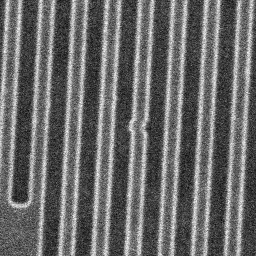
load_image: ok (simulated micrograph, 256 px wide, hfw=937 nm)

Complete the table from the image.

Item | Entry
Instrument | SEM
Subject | parallel lines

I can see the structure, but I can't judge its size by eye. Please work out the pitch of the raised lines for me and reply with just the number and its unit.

121 nanometers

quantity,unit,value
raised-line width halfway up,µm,0.0517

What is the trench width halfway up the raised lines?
71.8 nanometres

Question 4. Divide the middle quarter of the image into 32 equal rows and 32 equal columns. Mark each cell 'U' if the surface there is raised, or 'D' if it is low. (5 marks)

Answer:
DDUUUDDDDDUUUDDDDDUUUDDDDDUUUUDD
DDUUUDDDDDUUUDDDDDUUUDDDDDUUUDDD
DUUUUDDDDDUUUDDDDDUUUDDDDDUUUDDD
DUUUUDDDDDUUUDDDDDUUUDDDDDUUUDDD
DUUUUDDDDDUUUDDDDDUUUDDDDDUUUDDD
DUUUUDDDDDUUUDDDDDUUUDDDDDUUUDDD
DUUUDDDDDUUUUDDDDDUUUDDDDDUUUDDD
DUUUDDDDDUUUUDDDDDUUUDDDDDUUUDDD
DUUUDDDDDUUUUDDDDDUUUDDDDDUUUDDD
DUUUDDDDDUUUUDDDDDUUUDDDDDUUUDDD
DUUUDDDDDUUUUDDDDUUUUDDDDDUUUDDD
DUUUDDDDDUUUUDDDDUUUUDDDDDUUUDDD
DUUUDDDDDUUUDDDDDUUUUDDDDDUUUDDD
DUUUDDDDDUUUDDDDDUUUUDDDDDUUUDDD
DUUUDDDDDUUUDDDDDUUUDDDDDDUUUDDD
DUUUDDDDDUUUDDDDDUUUDDDDDUUUUDDD
DUUUDDDDDUUUDDDDUUUUDDDDDUUUUDDD
DUUUDDDDDUUUDDDDDUUUDDDDDUUUUDDD
DUUUDDDDDUUUDDDDDUUUDDDDDUUUUDDD
DUUUDDDDDUUUDDDDDUUUDDDDDUUUUDDD
DUUUDDDDDUUUDDDDDUUUDDDDDUUUDDDD
UUUUDDDDDUUUDDDDDUUUDDDDDUUUDDDD
UUUUDDDDDUUUDDDDDUUUDDDDDUUUDDDD
UUUUDDDDDUUUDDDDDUUUDDDDDUUUDDDD
UUUDDDDDDUUUDDDDDUUUDDDDDUUUDDDD
UUUDDDDDUUUUDDDDDUUUDDDDDUUUDDDD
UUUDDDDDUUUUDDDDDUUUDDDDDUUUDDDD
UUUDDDDDUUUUDDDDDUUUDDDDDUUUDDDD
UUUDDDDDUUUUDDDDDUUUDDDDDUUUDDDD
UUUDDDDDUUUUDDDDUUUUDDDDDUUUDDDD
UUUDDDDDUUUUDDDDUUUUDDDDDUUUDDDD
UUUDDDDDUUUDDDDDUUUUDDDDDUUUDDDD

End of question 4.